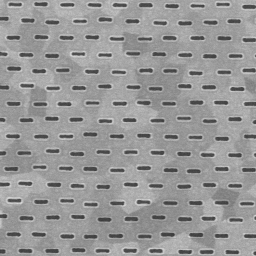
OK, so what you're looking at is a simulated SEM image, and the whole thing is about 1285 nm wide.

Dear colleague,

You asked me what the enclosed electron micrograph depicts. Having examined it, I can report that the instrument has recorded a regular array of holes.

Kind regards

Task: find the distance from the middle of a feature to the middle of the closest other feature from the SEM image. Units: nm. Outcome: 99.5